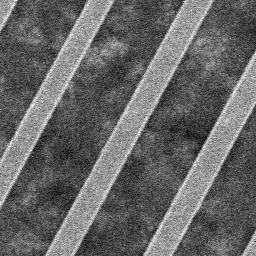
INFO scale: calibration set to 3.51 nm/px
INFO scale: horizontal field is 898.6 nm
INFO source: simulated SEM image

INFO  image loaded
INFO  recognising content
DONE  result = one or a few lines or trenches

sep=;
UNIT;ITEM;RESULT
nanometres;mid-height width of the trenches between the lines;224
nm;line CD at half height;82.7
